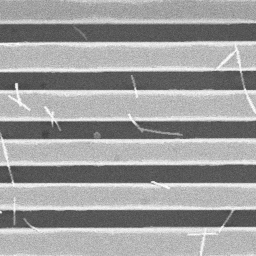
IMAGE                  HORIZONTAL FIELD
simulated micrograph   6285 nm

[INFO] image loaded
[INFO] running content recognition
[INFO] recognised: lines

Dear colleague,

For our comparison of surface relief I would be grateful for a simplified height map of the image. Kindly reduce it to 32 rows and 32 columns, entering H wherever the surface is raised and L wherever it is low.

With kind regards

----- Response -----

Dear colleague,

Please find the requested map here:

HHHHHHHHHHHHHHHHHHHHHHHHHHHHHHHH
HHHHHHHHHHHHHHHHHHHHHHHHHHHHHHHH
HHHHHHHHHHHHHHHHHHHHHHHHHHHHHHHH
LLLLLLLLLLLLLLLLLLLLLLLLLLLLLLLL
LLLLLLLLLLLLLLLLLLLLLLLLLLLLLLLL
HHHHHHHHHHHHHHHHHHHHHHHHHHHHHHHH
HHHHHHHHHHHHHHHHHHHHHHHHHHHHHHHH
HHHHHHHHHHHHHHHHHHHHHHHHHHHHHHHH
HHHHHHHHHHHHHHHHHHHHHHHHHHHHHHHH
LLLLLLLLLLLLLLLLLLLLLLLLLLLLLLLL
LLLLLLLLLLLLLLLLLLLLLLLLLLLLLLLL
HHHHHHHHHHHHHHHHHHHHHHHHHHHHHHHH
HHHHHHHHHHHHHHHHHHHHHHHHHHHHHHHH
HHHHHHHHHHHHHHHHHHHHHHHHHHHHHHHH
HHHHHHHHHHHHHHHHHHHHHHHHHHHHHHHH
LLLLLLLLLLLLLLLLLLLLLLLLLLLLLLLL
LLLLLLLLLLLLLLLLLLLLLLLLLLLLLLLL
HLHHHHHHHHHHHHHHHHHHHHHHHHHHHHHH
HHHHHHHHHHHHHHHHHHHHHHHHHHHHHHHH
HHHHHHHHHHHHHHHHHHHHHHHHHHHHHHHH
HHHHHHHHHHHHHHHHHHHHHHHLLLHHLLLL
LLLLLLLLLLLLLLLLLLLLLLLLLLLLLLLL
LLLLLLLLLLLLLLLLLLLLLLLLLLLLLLLL
HHHHHHHHHHHHHHHHHHHHHHHHHHHHHHHH
HHHHHHHHHHHHHHHHHHHHHHHHHHHHHHHH
HHHHHHHHHHHHHHHHHHHHHHHHHHHHHHHH
LLLLLLLLLLLLLLLLLLLLLLLLLLLLLLLL
LLLLLLLLLLLLLLLLLLLLLLLLLLLLLLLL
LLLLLLLLLLLLLLLLLLLLLLLLLLHHHHHH
HHHHHHHHHHHHHHHHHHHHHHHHHHHHHHHH
HHHHHHHHHHHHHHHHHHHHHHHHHHHHHHHH
HHHHHHHHHHHHHHHHHHHHHHHHHHHHHHHH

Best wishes